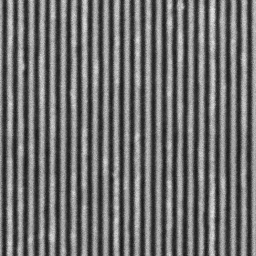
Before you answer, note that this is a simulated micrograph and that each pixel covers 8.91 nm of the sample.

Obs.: parallel lines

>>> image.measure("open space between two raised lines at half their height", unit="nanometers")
49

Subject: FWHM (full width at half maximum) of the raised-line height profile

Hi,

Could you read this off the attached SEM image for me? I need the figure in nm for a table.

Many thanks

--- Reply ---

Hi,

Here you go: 41.2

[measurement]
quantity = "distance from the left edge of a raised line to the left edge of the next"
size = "94.8 nm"